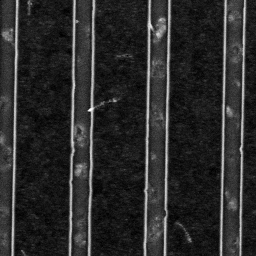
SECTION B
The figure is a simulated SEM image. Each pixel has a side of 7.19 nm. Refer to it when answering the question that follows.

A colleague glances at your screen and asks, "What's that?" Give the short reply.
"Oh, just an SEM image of one or a few lines or trenches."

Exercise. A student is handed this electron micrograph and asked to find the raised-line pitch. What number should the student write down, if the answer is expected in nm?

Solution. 545